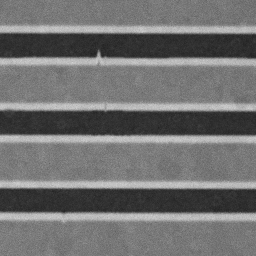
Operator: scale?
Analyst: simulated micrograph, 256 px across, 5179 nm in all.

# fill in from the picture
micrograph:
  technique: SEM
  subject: one or a few lines or trenches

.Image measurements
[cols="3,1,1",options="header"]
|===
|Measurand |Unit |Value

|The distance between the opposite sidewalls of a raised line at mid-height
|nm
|928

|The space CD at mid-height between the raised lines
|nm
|655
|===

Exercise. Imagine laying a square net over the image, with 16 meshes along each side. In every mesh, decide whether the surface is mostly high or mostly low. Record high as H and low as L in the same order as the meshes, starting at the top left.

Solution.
HHHHHHHHHHHHHHHH
HHHHHHHHHHHHHHHH
LLLLLLLLLLLLLLLL
LLLLLLLLLLLLLLLL
HHHHHHHHHHHHHHHH
HHHHHHHHHHHHHHHH
HHHHHHHHHHHHHHHH
LLLLLLLLLLLLLLLL
LLLLLLLLLLLLLLLL
HHHHHHHHHHHHHHHH
HHHHHHHHHHHHHHHH
HHHHHHHHHHHHHHHH
LLLLLLLLLLLLLLLL
LLLLLLLLLLLLLLLL
HHHHHHHHHHHHHHHH
HHHHHHHHHHHHHHHH